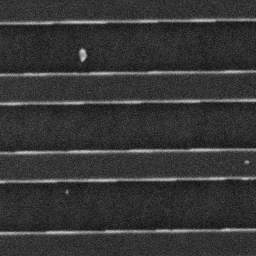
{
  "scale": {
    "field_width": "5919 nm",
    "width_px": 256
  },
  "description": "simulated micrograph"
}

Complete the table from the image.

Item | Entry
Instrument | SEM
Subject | lines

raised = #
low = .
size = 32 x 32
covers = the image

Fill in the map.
################################
################################
################################
................................
................................
................................
................................
................................
................................
################################
################################
################################
################################
................................
................................
................................
................................
................................
................................
################################
################################
################################
######################..........
................................
................................
................................
................................
................................
................................
################################
################################
################################